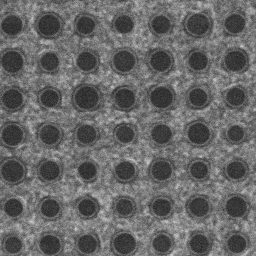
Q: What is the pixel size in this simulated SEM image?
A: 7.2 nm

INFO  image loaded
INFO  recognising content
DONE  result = a regular array of raised bodies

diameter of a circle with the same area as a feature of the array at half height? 152 nm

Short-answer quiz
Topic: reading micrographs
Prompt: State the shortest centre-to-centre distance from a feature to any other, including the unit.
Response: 36.4 px